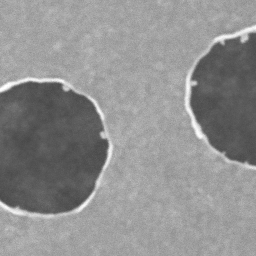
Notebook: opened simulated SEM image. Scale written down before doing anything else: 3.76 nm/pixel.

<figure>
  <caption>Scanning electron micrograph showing holes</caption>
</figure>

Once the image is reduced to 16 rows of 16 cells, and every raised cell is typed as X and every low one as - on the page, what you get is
XXXXXXXXXXXXXXXX
XXXXXXXXXXXXXXXX
XXXXXXXXXXXXXX--
XXXXXXXXXXXXX---
XXXXXXXXXXXX----
X---XXXXXXXX----
------XXXXXX----
------XXXXXX----
-------XXXXXX---
-------XXXXXXX--
------XXXXXXXXXX
------XXXXXXXXXX
-----XXXXXXXXXXX
XXXXXXXXXXXXXXXX
XXXXXXXXXXXXXXXX
XXXXXXXXXXXXXXXX